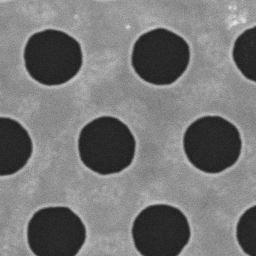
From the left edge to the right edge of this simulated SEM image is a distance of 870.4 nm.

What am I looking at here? holes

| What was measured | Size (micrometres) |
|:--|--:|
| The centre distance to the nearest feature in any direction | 0.349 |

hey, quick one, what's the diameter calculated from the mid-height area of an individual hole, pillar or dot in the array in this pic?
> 196 nm